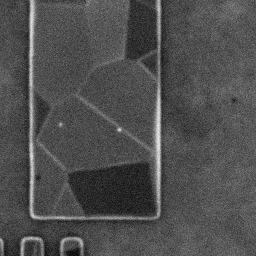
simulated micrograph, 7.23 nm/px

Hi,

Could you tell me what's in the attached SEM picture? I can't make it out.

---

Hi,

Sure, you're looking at wiring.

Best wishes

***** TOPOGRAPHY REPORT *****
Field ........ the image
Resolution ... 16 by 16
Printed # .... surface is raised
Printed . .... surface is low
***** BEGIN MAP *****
..########......
..########......
..########......
..########......
..########......
..########......
..########......
..########......
..########......
..########......
..########......
..########......
..########......
..########......
................
.##.#...........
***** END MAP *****